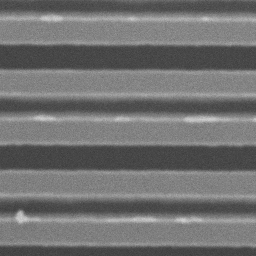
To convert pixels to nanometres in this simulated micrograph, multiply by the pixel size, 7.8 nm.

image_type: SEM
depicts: lines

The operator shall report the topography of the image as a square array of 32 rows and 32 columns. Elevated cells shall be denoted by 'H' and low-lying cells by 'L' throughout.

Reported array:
LLLLLLLLLLLLLLLLLLLLLLLLLLLLLLLL
LLLLLLLLLLLLLLLLLLLLLLLLLLLLLLLL
HHHHHHHHHHHHHHHHHHHHHHHHHHHHHHHH
HHHHHHHHHHHHHHHHHHHHHHHHHHHHHHHH
HHHHHHHHHHHHHHHHHHHHHHHHHHHHHHHH
LLLLLLLLLLLLLLLLLLLLLLHHHHHHHHHH
LLLLLLLLLLLLLLLLLLLLLLLLLLLLLLLL
LLLLLLLLLLLLLLLLLLLLLLLLLLLLLLLL
LLLLLLLLLLLLLLLLLLLLLLLLLLLLLLLL
HHHHHHHHHHHHHHHHHHHHHHHHHHHHHHHH
HHHHHHHHHHHHHHHHHHHHHHHHHHHHHHHH
HHHHHHHHHHHHHHHHHHHHHHHHHHHHHHHH
LLLLLLLLLLLLLLLLLLLLLLLLLLLLLLLL
LLLLLLLLLLLLLLLLLLLLLLLLLLLLLLLL
LLLHHHLLHHLLLLLLLLLLLLLLLLLLLLLL
HHHHHHHHHHHHHHHHHHHHHHHHHHHHHHHH
HHHHHHHHHHHHHHHHHHHHHHHHHHHHHHHH
HHHHHHHHHHHHHHHHHHHHHHHHHHHHHHHH
LLLLLLLLLLLLLLLLLLLLLLLLLLLLLLLL
LLLLLLLLLLLLLLLLLLLLLLLLLLLLLLLL
LLLLLLLLLLLLLLLLLLLLLLLLLLLLLLLL
HHHHHHHHHHHHHHHHHHHHHHHHHLLLLLLL
HHHHHHHHHHHHHHHHHHHHHHHHHHHHHHHH
HHHHHHHHHHHHHHHHHHHHHHHHHHHHHHHH
HHHHHHHHHHHHHHHHHHHHHHHHHHHHHHHH
LLLLLLLLLLLLLLLLLLLLLLLLLLLLLLLL
LLLLLLLLLLLLLLLLLLLLLLLLLLLLLLLL
HHHHHHHHHHHHHHHHHHHHHHHHHHHHHHHH
HHHHHHHHHHHHHHHHHHHHHHHHHHHHHHHH
HHHHHHHHHHHHHHHHHHHHHHHHHHHHHHHH
HHHHHHHHHHHHHHHHHHHHHHHHHHHHHHHH
LLLLLLLLLLLLLLLLLLLLLLLLLLLLLLLL